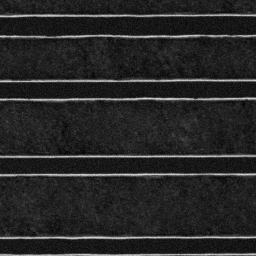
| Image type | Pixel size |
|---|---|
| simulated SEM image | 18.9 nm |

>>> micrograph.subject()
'one or a few lines or trenches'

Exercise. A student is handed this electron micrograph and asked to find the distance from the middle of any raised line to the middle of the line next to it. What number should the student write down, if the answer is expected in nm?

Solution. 1370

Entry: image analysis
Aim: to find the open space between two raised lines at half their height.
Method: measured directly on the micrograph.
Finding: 1090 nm